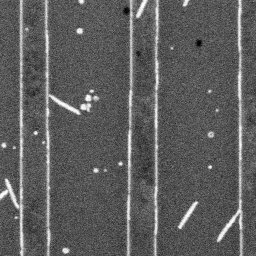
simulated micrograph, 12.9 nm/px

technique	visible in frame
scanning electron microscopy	lines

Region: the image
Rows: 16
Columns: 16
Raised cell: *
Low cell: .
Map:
.**.....**.....*
.**.....**.....*
.**.....**.....*
.**.....**.....*
.**.....**.....*
.**.....**.....*
.**.....**.....*
.**.....**.....*
.**.....**.....*
.**.....**.....*
.**.....**.....*
.**.....**.....*
.**.....**.....*
.**.....**.....*
.**.....**.....*
.**.....**.....*